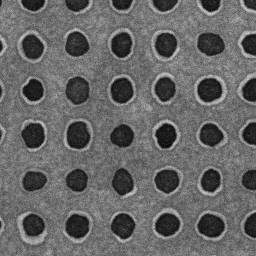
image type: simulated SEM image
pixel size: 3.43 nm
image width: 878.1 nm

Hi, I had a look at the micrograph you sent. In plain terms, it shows a regular array of holes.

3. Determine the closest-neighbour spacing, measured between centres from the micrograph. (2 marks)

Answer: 150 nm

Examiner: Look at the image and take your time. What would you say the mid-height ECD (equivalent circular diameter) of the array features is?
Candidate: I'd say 83.5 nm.